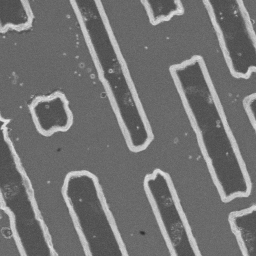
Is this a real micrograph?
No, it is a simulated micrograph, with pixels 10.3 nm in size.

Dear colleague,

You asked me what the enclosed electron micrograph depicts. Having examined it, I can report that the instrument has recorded one or a few lines or trenches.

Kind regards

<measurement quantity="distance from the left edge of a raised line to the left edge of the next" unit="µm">0.713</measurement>